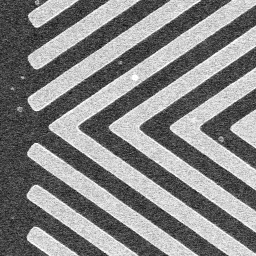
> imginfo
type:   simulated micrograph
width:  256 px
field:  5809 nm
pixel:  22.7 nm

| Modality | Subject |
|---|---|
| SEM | groups of lines, slits or small figures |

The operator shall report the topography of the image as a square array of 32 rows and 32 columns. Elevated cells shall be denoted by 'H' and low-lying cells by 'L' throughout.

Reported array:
LLLLLHHHHLLLLHHHHLLLLHHHLLLLHHHH
LLLLHHHLLLLLHHHLLLLHHHHLLLLHHHHL
LLLLHHLLLLHHHHLLLLHHHLLLLHHHHLLL
LLLLLLLLLHHHLLLLHHHHLLLLHHHHLLLL
LLLLLLLHHHHLLLLHHHLLLLHHHHLLLLHH
LLLLLLHHHLLLLHHHHLLLLHHHHLLLLHHH
LLLLHHHHLLLLHHHHLLLLHHHLLLLHHHHL
LLLLHHLLLLHHHHLLLLHHHHLLLLHHHLLL
LLLLHLLLLHHHHLLLLHHHLLLLHHHHLLLL
LLLLLLLHHHHLLLLHHHHLLLLHHHLLLLLH
LLLLLLHHHHLLLLHHHLLLLHHHHLLLLHHH
LLLLLHHHLLLLHHHHLLLLHHHHLLLLHHHL
LLLLHHHLLLLHHHLLLLHHHHLLLLHHHHLL
LLLLHLLLLHHHHLLLLHHHHLLLLHHHLLLL
LLLLLLLLHHHLLLLLHHHLLLLHHHHLLLLH
LLLLLLHHHHLLLLHHHHLLLLHHHLLLLHHH
LLLLLLLHHHLLLLHHHHLLLLHHHLLLLHHH
LLLLLLLLHHHHLLLLHHHLLLLHHHHLLLLH
LLLLHLLLLLHHHLLLLHHHLLLLHHHHLLLL
LLLLHHHLLLLHHHLLLLHHHHLLLLHHHLLL
LLLLLHHHLLLLHHHHLLLLHHHLLLLHHHHL
LLLLLLHHHHLLLLHHHLLLLHHHHLLLLHHH
LLLLLLLLHHHLLLLHHHHLLLLHHHLLLLHH
LLLLHLLLLHHHHLLLLHHHLLLLHHHHLLLL
LLLHHHHLLLHHHHLLLLHHHHLLLLHHHLLL
LLLLHHHHLLLLHHHLLLLHHHHLLLLHHHHL
LLLLLLHHHLLLLHHHHLLLLHHHLLLLHHHH
LLLLLLLHHHHLLLLHHHLLLLHHHHLLLLHH
LLLLHLLLLHHHLLLLHHHHLLLLHHHLLLLH
LLLHHHLLLLHHHHLLLLHHHLLLLHHHHLLL
LLLLHHHHLLLLHHHLLLLHHHHLLLLHHHLL
LLLLLLHHHLLLLHHHHLLLHHHHLLLLHHHH